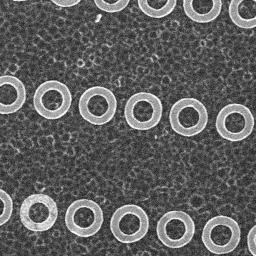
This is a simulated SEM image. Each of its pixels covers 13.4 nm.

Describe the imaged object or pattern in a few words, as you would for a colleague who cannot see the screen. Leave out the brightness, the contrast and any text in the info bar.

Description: a regular array of ring-shaped raised bodies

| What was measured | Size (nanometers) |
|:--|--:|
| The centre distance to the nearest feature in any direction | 612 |